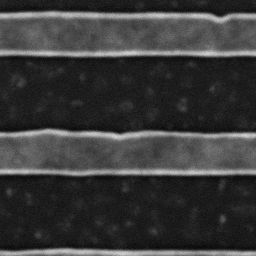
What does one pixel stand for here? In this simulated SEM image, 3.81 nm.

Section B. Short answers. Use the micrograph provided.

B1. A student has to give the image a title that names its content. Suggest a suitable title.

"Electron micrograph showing one or a few lines or trenches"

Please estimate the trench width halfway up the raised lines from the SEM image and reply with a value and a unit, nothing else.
301 nm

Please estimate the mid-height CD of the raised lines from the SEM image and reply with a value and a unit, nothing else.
151 nanometers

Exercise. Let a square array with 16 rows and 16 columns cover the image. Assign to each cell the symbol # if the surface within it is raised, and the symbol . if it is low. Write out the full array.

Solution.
................
################
################
................
................
................
................
................
################
################
################
................
................
................
................
................